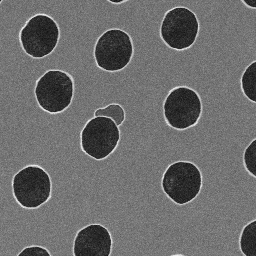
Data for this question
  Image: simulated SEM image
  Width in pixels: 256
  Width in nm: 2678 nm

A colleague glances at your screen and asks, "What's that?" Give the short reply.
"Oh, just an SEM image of a regular array of holes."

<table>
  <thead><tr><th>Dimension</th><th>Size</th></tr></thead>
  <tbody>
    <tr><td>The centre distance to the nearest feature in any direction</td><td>726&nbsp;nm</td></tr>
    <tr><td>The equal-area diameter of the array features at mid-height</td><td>411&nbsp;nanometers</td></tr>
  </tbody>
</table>